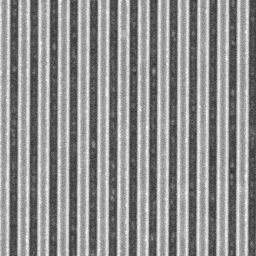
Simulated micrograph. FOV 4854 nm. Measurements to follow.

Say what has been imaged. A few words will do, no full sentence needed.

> parallel lines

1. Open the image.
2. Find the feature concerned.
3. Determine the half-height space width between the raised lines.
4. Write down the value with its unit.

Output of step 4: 194 nanometers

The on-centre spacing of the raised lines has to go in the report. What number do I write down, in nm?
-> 377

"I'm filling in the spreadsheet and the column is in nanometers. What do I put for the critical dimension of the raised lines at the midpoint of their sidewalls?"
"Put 194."